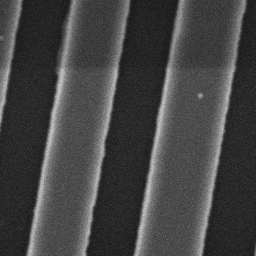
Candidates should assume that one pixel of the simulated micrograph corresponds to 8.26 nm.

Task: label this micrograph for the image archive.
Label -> lines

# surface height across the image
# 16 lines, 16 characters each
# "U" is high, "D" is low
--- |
UDDDUUUUDDDUUUUD
UDDDUUUUDDDUUUUD
UDDDUUUUDDDUUUUD
UDDDUUUUDDDUUUUD
UDDDUUUDDDUUUUUD
DDDDUUUDDDUUUUDD
DDDUUUUDDDUUUUDD
DDDUUUUDDDUUUUDD
DDDUUUUDDDUUUUDD
DDDUUUDDDDUUUUDD
DDDUUUDDDUUUUUDD
DDUUUUDDDUUUUDDD
DDUUUUDDDUUUUDDD
DDUUUUDDDUUUUDDD
DDUUUUDDDUUUUDDD
DDUUUDDDDUUUUDDD